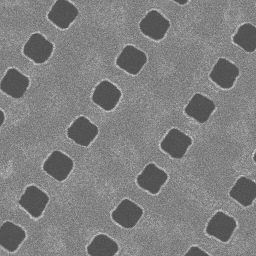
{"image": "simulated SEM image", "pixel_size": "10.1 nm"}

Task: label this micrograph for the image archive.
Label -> a regular array of holes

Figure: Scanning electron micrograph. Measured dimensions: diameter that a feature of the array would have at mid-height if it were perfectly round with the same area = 280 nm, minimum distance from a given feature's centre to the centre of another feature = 430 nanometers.